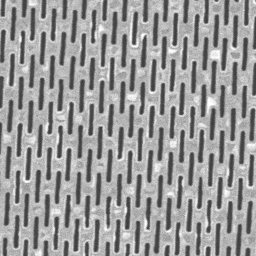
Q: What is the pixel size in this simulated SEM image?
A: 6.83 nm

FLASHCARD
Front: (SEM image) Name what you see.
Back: a regular array of holes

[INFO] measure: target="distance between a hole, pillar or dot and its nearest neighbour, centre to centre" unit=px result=20